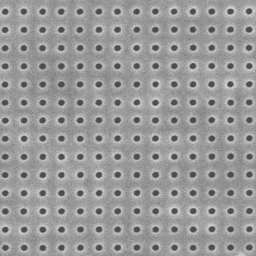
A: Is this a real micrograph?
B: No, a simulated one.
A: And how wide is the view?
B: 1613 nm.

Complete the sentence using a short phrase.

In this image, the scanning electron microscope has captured a regular array of holes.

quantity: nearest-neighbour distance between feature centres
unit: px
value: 17.9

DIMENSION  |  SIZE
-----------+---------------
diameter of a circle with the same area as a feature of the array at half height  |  6.49 pixels